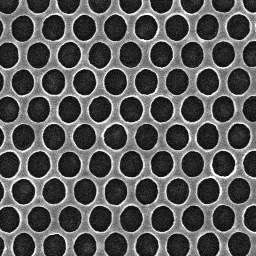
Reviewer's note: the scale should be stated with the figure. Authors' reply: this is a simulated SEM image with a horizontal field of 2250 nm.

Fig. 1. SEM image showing a regular array of holes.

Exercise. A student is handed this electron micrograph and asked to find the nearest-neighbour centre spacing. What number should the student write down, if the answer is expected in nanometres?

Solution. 269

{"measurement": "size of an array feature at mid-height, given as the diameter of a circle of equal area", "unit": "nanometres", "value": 217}